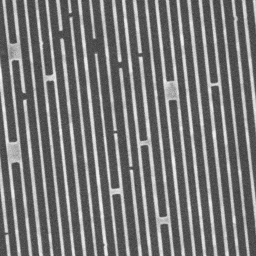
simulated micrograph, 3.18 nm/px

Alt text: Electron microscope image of parallel lines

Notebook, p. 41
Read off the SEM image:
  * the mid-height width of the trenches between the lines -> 26.1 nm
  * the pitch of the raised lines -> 34.6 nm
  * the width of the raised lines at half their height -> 2.48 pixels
